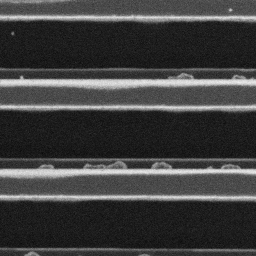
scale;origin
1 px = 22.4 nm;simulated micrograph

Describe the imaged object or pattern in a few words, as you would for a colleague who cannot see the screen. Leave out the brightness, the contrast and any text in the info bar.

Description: lines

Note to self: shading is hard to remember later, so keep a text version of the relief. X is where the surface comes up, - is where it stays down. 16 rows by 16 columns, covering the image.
XXXXXXXXXXXXXXXX
----------------
----------------
----------------
XXXXXXXXXXXXXXXX
XXXXXXXXXXXXXXXX
XXXXXXXXXXXXXXXX
----------------
----------------
----------------
XXXXXXXXXXXXXXXX
XXXXXXXXXXXXXXXX
----------------
----------------
----------------
----------------